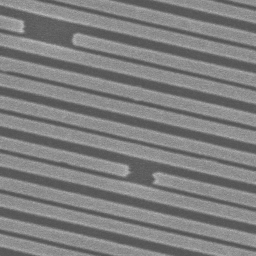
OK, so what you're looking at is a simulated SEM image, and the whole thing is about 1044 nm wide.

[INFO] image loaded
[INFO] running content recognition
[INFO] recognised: parallel lines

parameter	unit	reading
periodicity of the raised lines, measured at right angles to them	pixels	19.6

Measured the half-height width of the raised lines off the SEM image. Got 50.2 nm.